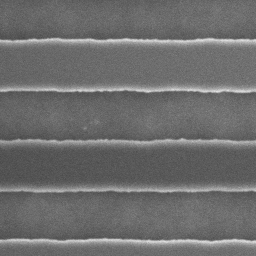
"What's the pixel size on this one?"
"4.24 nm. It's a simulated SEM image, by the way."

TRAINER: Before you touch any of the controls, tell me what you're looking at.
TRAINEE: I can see lines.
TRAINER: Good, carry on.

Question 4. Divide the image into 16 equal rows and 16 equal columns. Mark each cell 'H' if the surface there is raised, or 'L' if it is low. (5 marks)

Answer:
LLLLLLLLLLLLLLLL
LLLLLLLLLLLLLLLL
LHHHHHHHHLLLHHHH
HHHHHHHHHHHHHHHH
HHHHHHHHHHHHHHHH
HHHHHHHHHHHHHHHH
LLLLLLLLLLLLLLLL
LLLLLLLLLLLLLLLL
LLLLLLLLLLLLLLLL
HHHHHHHHHHHHHHHH
HHHHHHHHHHHHHHHH
HHHHHHHHHHHHHHHH
LLLLLLLLLLLLLLLL
LLLLLLLLLLLLLLLL
LLLLLLLLLLLLLLLL
HHHHHHHHHHHHHHHH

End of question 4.